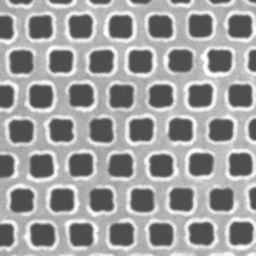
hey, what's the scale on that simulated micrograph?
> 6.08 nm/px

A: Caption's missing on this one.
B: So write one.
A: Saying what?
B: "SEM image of a regular array of holes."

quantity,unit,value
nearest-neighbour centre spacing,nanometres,240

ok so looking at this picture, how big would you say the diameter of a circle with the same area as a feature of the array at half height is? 157 nm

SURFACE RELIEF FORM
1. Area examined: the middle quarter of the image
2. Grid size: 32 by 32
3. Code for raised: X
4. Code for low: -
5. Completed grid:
--XXXX------XXXX------XXXX------
--XXXX------XXXX------XXXXX-----
XXXXXXXXXXXXXXXXXXXXXXXXXXXXXXXX
XXXXXXXXXXXXXXXXXXXXXXXXXXXXXXXX
XXXXXXXXXXXXXXXXXXXXXXXXXXXXXXXX
XX-----XXXXX-----XXXXX-----XXXX-
X------XXXXX-----XXXX------XXXX-
X-------XXX------XXXX------XXXX-
X------XXXX------XXXX------XXXX-
X------XXXX------XXXX------XXXX-
XX-----XXXXX-----XXXXX-----XXXXX
XXXXXXXXXXXXXXXXXXXXXXXXXXXXXXXX
XXXXXXXXXXXXXXXXXXXXXXXXXXXXXXXX
XXXXXXXXXX-XXXXXXXXX-XXXXXXXXXXX
--XXXXX-----XXXX------XXXX------
--XXXX------XXXX-------XXX------
--XXXXX-----XXXX------XXXX------
--XXXX------XXXX------XXXX------
--XXXXX-----XXXX------XXXX------
-XXXXXXX----XXXXXXXXXXXXXXXXXX-X
XXXXXXXXXXXXXXXXXXXXXXXXXXXXXXXX
XXXXXXXXXXXXXXXXXXXXXXXXXXXXXXXX
XX-----XXXXXXX--XXXXXXX---XXXXXX
X------XXXXX-----XXXX------XXXX-
X------XXXX------XXXX------XXXX-
X------XXXX------XXXX------XXXX-
X------XXXX------XXXX------XXXX-
XX-----XXXX------XXXXX-----XXXXX
XXXXXXXXXXXXXXXXXXXXXXXXX-XXXXXX
XXXXXXXXXXXXXXXXXXXXXXXXXXXXXXXX
XXXXXXXXXXXXXXXXXXXXXXXXXXXXXXXX
--XXXXX-----XXXXX-----XXXXX-----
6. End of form